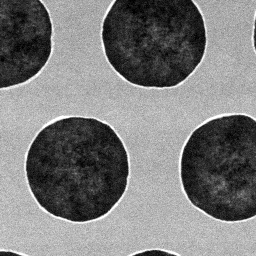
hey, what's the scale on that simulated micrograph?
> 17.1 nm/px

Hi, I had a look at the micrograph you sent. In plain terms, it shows holes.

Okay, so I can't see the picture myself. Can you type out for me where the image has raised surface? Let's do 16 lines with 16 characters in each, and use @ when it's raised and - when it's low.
---@@@@-----@@@@
---@@@-------@@@
---@@@-------@@@
---@@@@------@@@
--@@@@@-----@@@@
@@@@@@@@@@@@@@@@
@@@@@@@@@@@@@@@@
@@@@--@@@@@@@---
@@-----@@@@@----
@@------@@@-----
@@------@@@-----
@@------@@@-----
@@-----@@@@@----
@@@---@@@@@@@---
@@@@@@@@@@@@@@@@
@@@@@@@@@@@@@@@@